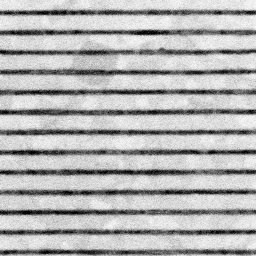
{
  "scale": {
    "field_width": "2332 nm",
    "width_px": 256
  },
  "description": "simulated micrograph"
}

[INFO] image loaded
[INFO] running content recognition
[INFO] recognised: parallel lines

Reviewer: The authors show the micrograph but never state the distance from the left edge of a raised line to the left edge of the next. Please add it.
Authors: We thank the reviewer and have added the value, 182 nm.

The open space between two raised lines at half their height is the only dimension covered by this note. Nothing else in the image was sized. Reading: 53.5 nanometres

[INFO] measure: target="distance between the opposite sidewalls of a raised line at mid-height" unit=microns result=0.129